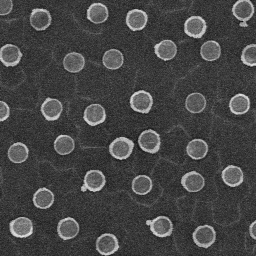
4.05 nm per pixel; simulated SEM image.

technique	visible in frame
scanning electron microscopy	a regular array of raised bodies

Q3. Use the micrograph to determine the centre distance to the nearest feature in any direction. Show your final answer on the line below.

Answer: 39.4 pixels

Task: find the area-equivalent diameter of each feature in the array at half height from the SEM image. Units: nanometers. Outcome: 86.8